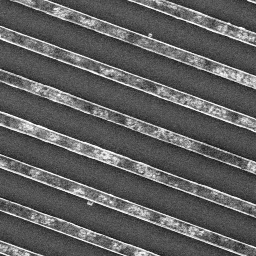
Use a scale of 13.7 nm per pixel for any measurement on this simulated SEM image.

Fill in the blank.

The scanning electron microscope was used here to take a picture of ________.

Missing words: parallel lines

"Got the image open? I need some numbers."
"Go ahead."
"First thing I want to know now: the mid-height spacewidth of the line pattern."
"0.391 um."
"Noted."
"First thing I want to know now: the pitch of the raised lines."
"550 nm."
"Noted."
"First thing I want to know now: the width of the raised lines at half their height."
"0.157 um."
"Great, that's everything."